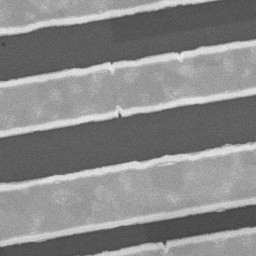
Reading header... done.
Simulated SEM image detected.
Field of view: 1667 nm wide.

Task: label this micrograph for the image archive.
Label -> one or a few lines or trenches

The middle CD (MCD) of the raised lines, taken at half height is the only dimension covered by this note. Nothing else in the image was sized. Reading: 50.2 pixels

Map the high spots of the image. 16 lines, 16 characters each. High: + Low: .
+++++++++.......
+++.............
................
...........+++++
.....+++++++++++
++++++++++++++++
+++++++++++.....
+++++...........
................
..............++
........++++++++
..++++++++++++++
++++++++++++++++
++++++++++......
++++...........+
.........+++++++